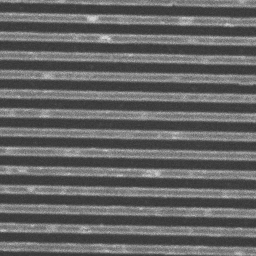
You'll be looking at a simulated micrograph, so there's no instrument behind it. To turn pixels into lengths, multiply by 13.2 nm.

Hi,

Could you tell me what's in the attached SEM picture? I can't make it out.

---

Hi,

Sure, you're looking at parallel lines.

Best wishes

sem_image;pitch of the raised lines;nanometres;252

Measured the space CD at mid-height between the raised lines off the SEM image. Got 138 nanometers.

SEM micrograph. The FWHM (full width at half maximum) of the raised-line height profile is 114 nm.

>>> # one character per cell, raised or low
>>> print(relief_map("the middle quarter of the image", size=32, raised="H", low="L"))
LLLLLLLLLLLLLLLLLLLLLLLLLLLLLLLL
LLLLLLLLLLLLLLLLLLLLLLLLLLLLLLLL
HHHHHHHHHHHHHHHHHHHHHHHLLHHHHHHH
HHHHHHHHHHHHHHHHHHHHHHHHHHHHHHHH
LLLLLLLLLLLLLLLLLLLLLLLLLHHHHHHH
LLLLLLLLLLLLLLLLLLLLLLLLLLLLLLLL
LLLLLLLLLLLLLLLLLLLLLLLLLLLLLLLL
HHHHHHHHHHHHHHHHHHHHHHHHHHHHHHHH
HHHHHHHHHHHHHHHHHHHHHHHHHHHHHHHH
LLLLLLLLLLLLLLLLLLLLLLLLLLLLLLLL
LLLLLLLLLLLLLLLLLLLLLLLLLLLLLLLL
HHHHLLLLLLLLLLLLLLLLLLLLLLLLLLLL
HHHHHHHHHHHHHHHHHHHHHHHHHHHHHHHH
HHHHHHHLHHHHHHHHHHHHHHHHHHHHHHHH
LLLLLLLLLLLLLLLLLLLLLLLLLLLLLLLL
LLLLLLLLLLLLLLLLLLLLLLLLLLLLLLLL
HHHHHHHHHHHHHHLLLLLLLLLLLLLLLLLL
HHHHHHHHHHHHHHHHHHHHHHHHHHHHHHHH
LLLLLLLLHLLHHHHHHHHHHHHHHHHHHHHH
LLLLLLLLLLLLLLLLLLLLLLLLLLLLLLLL
LLLLLLLLLLLLLLLLLLLLLLLLLLLLLLLL
HHHHHHHHHHHHHHHHHLLHHHHHLLLLLLLL
HHHHHHHHHHHHHHHHHHHHHHHHHHHHHHHH
LLLLLLLLLLLLLLLLHHHLHHHHHHHHHHHH
LLLLLLLLLLLLLLLLLLLLLLLLLLLLLLLL
LLLLLLLLLLLLLLLLLLLLLLLLLLLLLLLL
HHHHHHHHHHHHHHHHHHHHHHHHHHHHHHHH
HHHHHHHHHHHHHHHHHHHHHHHHHHHHHHHH
LLLLLLLLLLLLLLLLLLLLLLLLLLHHLHHH
LLLLLLLLLLLLLLLLLLLLLLLLLLLLLLLL
LLLLLLLLLLLLLLLLLLLLLLLLLLLLLLLL
HHHHHHHHHHHHHHHHHHHHHHHHHHHHHHHH